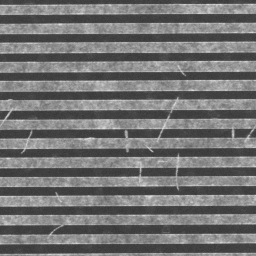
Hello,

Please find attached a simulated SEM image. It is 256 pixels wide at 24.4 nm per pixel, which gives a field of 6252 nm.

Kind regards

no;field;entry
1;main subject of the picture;parallel lines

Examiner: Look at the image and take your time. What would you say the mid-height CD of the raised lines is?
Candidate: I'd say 9.63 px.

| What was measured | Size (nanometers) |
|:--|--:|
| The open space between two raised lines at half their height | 232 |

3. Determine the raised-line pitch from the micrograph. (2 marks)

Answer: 467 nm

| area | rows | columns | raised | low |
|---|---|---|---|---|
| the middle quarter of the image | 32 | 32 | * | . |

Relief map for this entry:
********************************
********************************
................................
................................
********************************
********************************
******************************..
.....................*..........
.....................*..........
********************************
********************************
.......**................**.....
................................
................................
********************************
********************************
................................
................................
...............*.......*........
********************************
********************************
................................
................................
......**************************
********************************
********************************
................................
................................
********************************
********************************
***********.................*...
................................